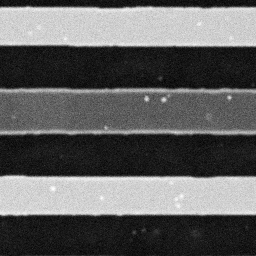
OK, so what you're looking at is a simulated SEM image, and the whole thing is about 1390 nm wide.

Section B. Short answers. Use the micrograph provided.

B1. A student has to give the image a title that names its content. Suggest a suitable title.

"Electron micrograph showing lines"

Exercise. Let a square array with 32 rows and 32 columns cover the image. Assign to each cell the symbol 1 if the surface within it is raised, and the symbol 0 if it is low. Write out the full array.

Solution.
00000000000000000000000000000000
11111111111111111111111111111111
11111111111111111111111111111111
11111111111111111111111111111111
11111111111111111111111111111111
11111111111111111111111111111111
00000000000000000000000000000000
00000000000000000000000000000000
00000000000000000000000000000000
00000000000000000000000000000000
00000000000000000000000000000000
11111111111111111111111111111111
11111111111111111111111111111111
11111111111111111111111111111111
11111111111111111111111111111111
11111111111111111111111111111111
11111111111111111111111111111111
00000000000000000000000000000000
00000000000000000000000000000000
00000000000000000000000000000000
00000000000000000000000000000000
00000000000000000000000000000000
11111111111111111111111111111111
11111111111111111111111111111111
11111111111111111111111111111111
11111111111111111111111111111111
11111111111111111111111111111111
00000000000000000000000000000000
00000000000000000000000000000000
00000000000000000000000000000000
00000000000000000000000000000000
00000000000000000000000000000000